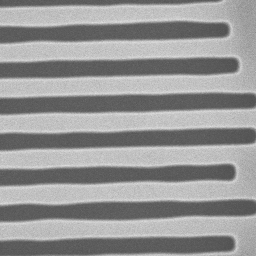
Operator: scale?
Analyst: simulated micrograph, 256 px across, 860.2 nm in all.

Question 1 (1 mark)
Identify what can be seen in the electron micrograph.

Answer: groups of lines, slits or small figures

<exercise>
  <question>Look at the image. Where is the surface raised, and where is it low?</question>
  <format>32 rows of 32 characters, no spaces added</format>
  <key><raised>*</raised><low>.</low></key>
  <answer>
.......................*********
********************************
********************************
.............................***
............................****
.*******************************
********************************
******........................**
..............................**
.....................***..******
********************************
********************************
................................
................................
********************************
********************************
*********...**..................
................................
..............******************
********************************
***************************..***
.............................***
.............................***
********************************
********************************
**....**........................
................................
...................*************
********************************
*************************...****
.............................***
............................****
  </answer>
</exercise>